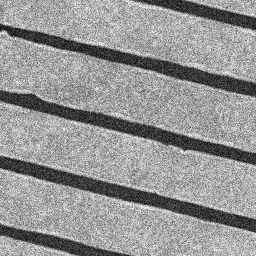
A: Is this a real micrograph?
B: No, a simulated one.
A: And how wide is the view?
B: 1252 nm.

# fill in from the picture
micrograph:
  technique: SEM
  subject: one or a few lines or trenches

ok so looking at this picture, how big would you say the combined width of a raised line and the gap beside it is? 322 nm